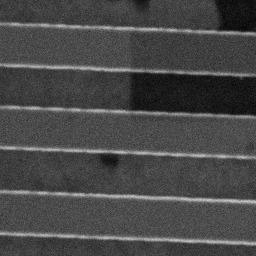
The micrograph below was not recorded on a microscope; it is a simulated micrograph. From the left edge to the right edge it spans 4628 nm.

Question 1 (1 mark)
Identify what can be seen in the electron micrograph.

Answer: lines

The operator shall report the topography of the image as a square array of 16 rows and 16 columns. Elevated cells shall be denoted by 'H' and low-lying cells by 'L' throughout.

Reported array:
LLLLLLLLLLLLLLLL
HHLLLLLLLLLLLLLL
HHHHHHHHHHHHHHHH
HHHHHHHHHHHHHHHH
LLLLLLLLLHHHHHHH
LLLLLLLLLLLLLLLL
LLLLLLLLLLLLLLLL
HHHHHHHHHHHHHHHH
HHHHHHHHHHHHHHHH
LLLLLLLHHHHHHHHH
LLLLLLLLLLLLLLLL
LLLLLLLLLLLLLLLL
HHHHHHHHHHHHHHHL
HHHHHHHHHHHHHHHH
HHHHHHHHHHHHHHHH
LLLLLLLLLLLLLLLL